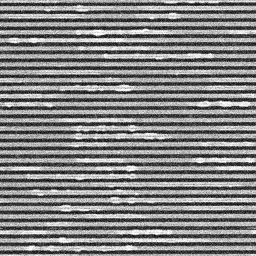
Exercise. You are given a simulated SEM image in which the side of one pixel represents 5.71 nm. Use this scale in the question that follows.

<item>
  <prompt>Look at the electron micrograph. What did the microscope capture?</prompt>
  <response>parallel lines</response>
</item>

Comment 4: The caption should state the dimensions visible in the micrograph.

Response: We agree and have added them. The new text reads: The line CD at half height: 22.1 nanometers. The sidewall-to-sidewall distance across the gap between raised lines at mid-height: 27.9 nanometres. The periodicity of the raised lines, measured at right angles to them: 45.8 nm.